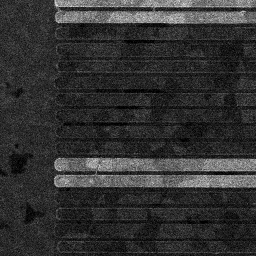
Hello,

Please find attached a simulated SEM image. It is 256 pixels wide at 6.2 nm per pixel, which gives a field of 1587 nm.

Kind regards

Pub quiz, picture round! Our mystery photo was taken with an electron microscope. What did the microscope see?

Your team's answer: parallel lines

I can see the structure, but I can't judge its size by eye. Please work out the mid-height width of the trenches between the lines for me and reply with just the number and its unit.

0.0271 microns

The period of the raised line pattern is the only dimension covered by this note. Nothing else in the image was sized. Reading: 0.102 um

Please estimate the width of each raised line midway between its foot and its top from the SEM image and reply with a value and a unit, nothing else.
74.4 nm